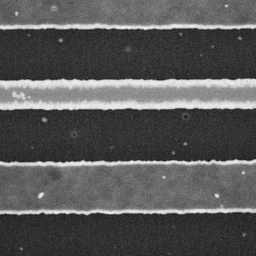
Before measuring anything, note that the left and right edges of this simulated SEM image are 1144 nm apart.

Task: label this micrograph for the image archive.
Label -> lines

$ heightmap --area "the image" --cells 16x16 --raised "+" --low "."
++++++++++++++++
++++++++++++++++
................
................
................
++++++++++++++++
++++++++++++++++
................
................
................
++++++++++++++++
++++++++++++++++
++++++++++++++++
................
................
................